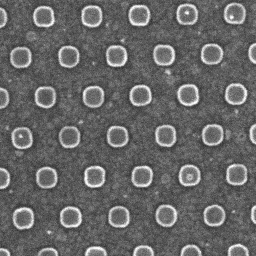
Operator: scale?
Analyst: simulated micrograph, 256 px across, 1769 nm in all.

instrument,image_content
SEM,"a regular array of raised bodies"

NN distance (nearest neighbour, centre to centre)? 46.5 pixels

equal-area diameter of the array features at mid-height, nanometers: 147